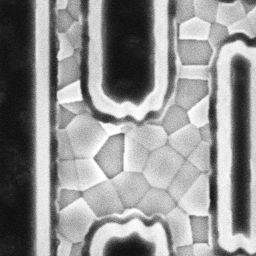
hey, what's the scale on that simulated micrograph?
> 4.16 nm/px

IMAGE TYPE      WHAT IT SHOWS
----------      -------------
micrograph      one or a few lines or trenches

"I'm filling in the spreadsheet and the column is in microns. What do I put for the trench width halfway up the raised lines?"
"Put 0.222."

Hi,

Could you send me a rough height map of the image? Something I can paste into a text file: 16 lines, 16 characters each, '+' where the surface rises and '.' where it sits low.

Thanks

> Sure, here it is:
+++...++++......
+++...++++......
+++...++++......
+++...++++....++
+++...++++....++
+++...++++....++
+++...++++....++
+++...........++
+++...........++
+++...........++
+++...........++
+++...........++
+++...........++
+++...........++
+++....+++....++
+++...++++......